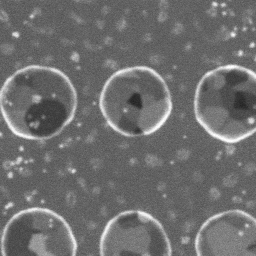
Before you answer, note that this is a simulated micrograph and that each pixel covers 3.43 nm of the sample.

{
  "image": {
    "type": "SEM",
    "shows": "raised bodies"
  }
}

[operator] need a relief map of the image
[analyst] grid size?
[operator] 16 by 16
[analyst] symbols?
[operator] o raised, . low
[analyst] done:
................
................
................
................
.ooo...ooo...ooo
ooooo..ooo..oooo
ooooo.ooooo.oooo
oooo...ooo..oooo
.oo...........o.
................
................
................
................
.ooo...oo....ooo
oooo...ooo..oooo
ooooo.ooooo.oooo